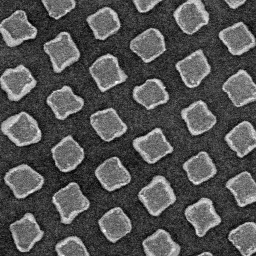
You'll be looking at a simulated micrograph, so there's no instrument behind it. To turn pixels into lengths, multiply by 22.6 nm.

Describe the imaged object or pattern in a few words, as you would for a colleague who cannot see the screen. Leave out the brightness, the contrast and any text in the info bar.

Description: a regular array of raised bodies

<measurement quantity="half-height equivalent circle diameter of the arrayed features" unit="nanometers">710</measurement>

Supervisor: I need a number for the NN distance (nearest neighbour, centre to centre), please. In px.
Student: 49.1